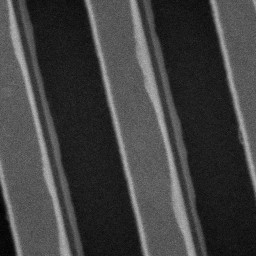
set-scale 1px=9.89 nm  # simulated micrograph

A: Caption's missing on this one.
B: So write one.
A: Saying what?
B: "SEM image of lines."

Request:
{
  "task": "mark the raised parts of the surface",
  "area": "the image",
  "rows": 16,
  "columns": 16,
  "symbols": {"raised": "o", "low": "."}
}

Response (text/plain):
o....oooo....ooo
oo....ooo....ooo
oo....oooo....oo
oo....oooo....oo
oo....oooo....oo
oo.....ooo....oo
ooo....oooo....o
ooo....oooo....o
ooo....oooo....o
ooo.....ooo....o
oooo....ooo.....
oooo....oooo....
oooo....oooo....
oooo....oooo....
.oooo....ooo....
.oooo....oooo...